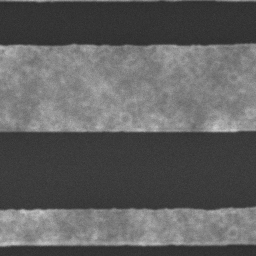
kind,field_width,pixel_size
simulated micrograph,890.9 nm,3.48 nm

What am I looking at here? lines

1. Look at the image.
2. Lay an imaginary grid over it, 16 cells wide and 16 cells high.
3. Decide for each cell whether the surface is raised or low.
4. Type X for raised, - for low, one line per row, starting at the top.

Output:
----------------
----------------
----------------
XXXXXXXXXXXXXXXX
XXXXXXXXXXXXXXXX
XXXXXXXXXXXXXXXX
XXXXXXXXXXXXXXXX
XXXXXXXXXXXXXXXX
----------------
----------------
----------------
----------------
----------------
XXXXXXXXXXXXXXXX
XXXXXXXXXXXXXXXX
----------------